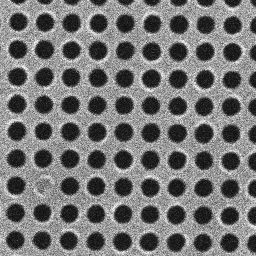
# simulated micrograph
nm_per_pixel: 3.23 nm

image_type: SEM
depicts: a regular array of holes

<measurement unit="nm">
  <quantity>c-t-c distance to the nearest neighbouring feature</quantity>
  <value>86.1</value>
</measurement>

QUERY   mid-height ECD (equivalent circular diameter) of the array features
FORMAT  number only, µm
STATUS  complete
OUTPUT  0.0621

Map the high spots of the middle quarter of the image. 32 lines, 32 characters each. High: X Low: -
XXXXXXXXXXXXXXXXXXXXXXXXXXXXXXXX
---XXXX---XXXX--XXXXX--XXXX---XX
----XX-----XX----XXX----XX-----X
----XX-----XX-----X-----XX-----X
----XX-----XX----XX-----XX-----X
---XXXX---XXXX---XXX----XXX---XX
XXXXXXXXXXXXXXXXXXXXXXXXXXXXXXXX
XXXXXXXXXXXXXXXXXXXXXXXXXXXXXXXX
---XXXX---XXXX---XXX---XXXX---XX
----XX-----XX----XXX----XX-----X
----XX-----XX-----X-----XX-----X
----XX----XXX----XXX----XX-----X
X-XXXXX--XXXXX--XXXXX--XXXX---XX
XXXXXXXXXXXXXXXXXXXXXXXXXXXXXXXX
X-XXXXXX-XXXXXXXXXXXXXXXXXXXXXXX
----XX----XXX----XXX---XXXX---XX
----XX-----XX----XXX----XX-----X
----XX-----X-----XX-----XX-----X
----XX----XXX----XX-----XX-----X
XXXXXXX--XXXXX-XXXXXX-XXXXX---XX
XXXXXXXXXXXXXXXXXXXXXXXXXXXXXXXX
X--XXXX--XXXXXXXXXXXXXXXXXXXXXXX
----XX----XXX----XXX----XX----XX
----XX----XX-----XX-----XX-----X
----XX----XXX----XX-----XX-----X
---XXX----XXX----XXX----XX----XX
XXXXXXXXXXXXXXXXXXXXX-XXXXX--XXX
XXXXXXXXXXXXXXXXXXXXXXXXXXXXXXXX
---XXXX--XXXXXXXXXXXX-XXXXXXXXXX
----XX----XXX----XXX----XX----XX
----XX-----XX----XX-----XX----XX
----XX----XXX----XX-----XX----XX